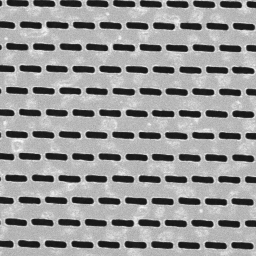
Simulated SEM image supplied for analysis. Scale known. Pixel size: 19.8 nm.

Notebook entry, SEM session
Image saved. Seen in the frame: a regular array of holes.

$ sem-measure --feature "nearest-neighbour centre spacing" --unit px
25.2